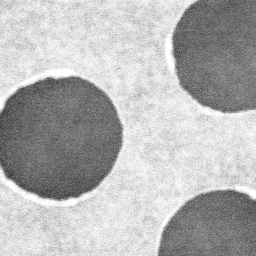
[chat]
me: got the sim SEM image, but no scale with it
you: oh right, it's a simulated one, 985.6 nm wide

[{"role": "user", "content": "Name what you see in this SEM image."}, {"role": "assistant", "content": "holes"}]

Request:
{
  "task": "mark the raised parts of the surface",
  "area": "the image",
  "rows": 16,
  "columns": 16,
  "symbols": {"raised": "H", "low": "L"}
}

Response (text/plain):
HHHHHHHHHHHHLLLL
HHHHHHHHHHHLLLLL
HHHHHHHHHHHLLLLL
HHHHHHHHHHHLLLLL
HHHHHHHHHHHLLLLL
HLLLLLHHHHHLLLLL
LLLLLLLHHHHHLLLL
LLLLLLLLHHHHHHHH
LLLLLLLLHHHHHHHH
LLLLLLLLHHHHHHHH
LLLLLLLHHHHHHHHH
HLLLLLHHHHHHHHHH
HHHLHHHHHHHHLLLL
HHHHHHHHHHHLLLLL
HHHHHHHHHHLLLLLL
HHHHHHHHHHLLLLLL